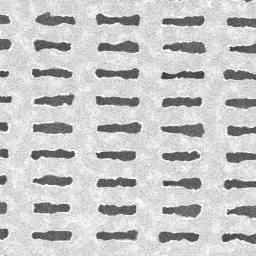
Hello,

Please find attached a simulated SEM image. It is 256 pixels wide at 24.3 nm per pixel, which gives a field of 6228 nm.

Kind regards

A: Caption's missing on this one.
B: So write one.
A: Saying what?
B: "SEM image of a regular array of holes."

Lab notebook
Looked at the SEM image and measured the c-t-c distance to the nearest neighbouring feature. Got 26.9 pixels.